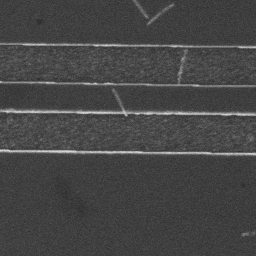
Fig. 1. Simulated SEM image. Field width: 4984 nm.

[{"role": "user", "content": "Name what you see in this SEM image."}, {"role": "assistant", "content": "lines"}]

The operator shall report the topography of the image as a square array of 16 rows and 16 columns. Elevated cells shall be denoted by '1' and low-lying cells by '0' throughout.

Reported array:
1111111111111111
1111111111111111
1111111111111111
0000000000000000
0000000000000000
1111111111111111
1111111111111111
0000000000000000
0000000000000000
1111111110000000
1111111111111111
1111111111111111
1111111111111111
1111111111111111
1111111111111111
1111111111111111